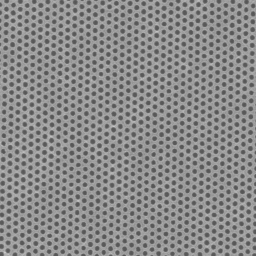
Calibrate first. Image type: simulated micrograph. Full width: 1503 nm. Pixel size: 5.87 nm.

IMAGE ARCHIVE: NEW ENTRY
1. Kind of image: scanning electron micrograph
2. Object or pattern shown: a regular array of holes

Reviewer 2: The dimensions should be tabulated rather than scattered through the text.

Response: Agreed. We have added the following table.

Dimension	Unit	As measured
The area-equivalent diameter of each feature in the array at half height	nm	28.1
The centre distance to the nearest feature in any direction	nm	44.6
